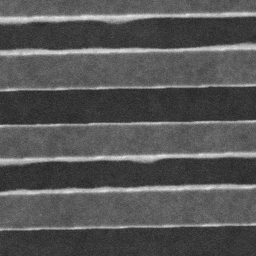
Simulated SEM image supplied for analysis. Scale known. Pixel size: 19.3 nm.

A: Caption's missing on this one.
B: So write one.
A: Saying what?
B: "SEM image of lines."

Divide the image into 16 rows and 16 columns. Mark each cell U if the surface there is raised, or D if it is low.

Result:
UUUUUUUUUUUUUUUU
DDDDDDDDDDDDDDDD
DDDDDDDDDDDDDDDD
UUUUUUUUUUUUUUUU
UUUUUUUUUUUUUUUU
UUUUUUUDDDDDDDDD
DDDDDDDDDDDDDDDD
DDDDDDDDDDDDDDDD
UUUUUUUUUUUUUUUU
UUUUUUUUUUUUUUUU
DDDDDDDDDDDDDDDD
DDDDDDDDDDDDDDDD
UUUUUUUUUUUUUUUU
UUUUUUUUUUUUUUUU
DDDDDDDDDDDDDDDD
DDDDDDDDDDDDDDDD